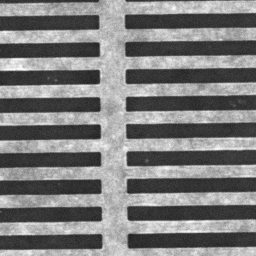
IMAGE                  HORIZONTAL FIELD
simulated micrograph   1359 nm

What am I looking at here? groups of lines, slits or small figures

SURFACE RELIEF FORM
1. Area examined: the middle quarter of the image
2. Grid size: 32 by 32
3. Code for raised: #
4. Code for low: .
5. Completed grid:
################################
.........######.................
.........######.................
.........######.................
.........######.................
......##########################
################################
################################
.........######.................
.........######.................
.........######.................
.........######.................
################################
################################
#########################..#####
.........######.................
.........######.................
.........######.................
.........#######................
################################
################################
###################.............
.........######.................
.........######.................
..........#####.................
.........#######................
################################
################################
################................
..........#####.................
..........#####.................
..........#####.................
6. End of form